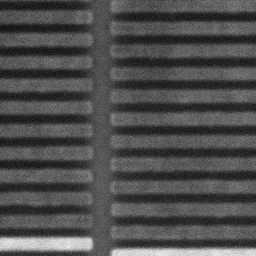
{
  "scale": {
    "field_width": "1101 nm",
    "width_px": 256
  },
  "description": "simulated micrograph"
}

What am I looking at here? groups of lines, slits or small figures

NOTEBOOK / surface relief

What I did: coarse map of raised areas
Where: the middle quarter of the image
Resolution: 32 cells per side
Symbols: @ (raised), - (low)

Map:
@@@@@@--------------------------
------------@@@@@@@@@@@@@@@@@@@@
------------@@@@@@@@@@@@@@@@@@@@
------------@@@@@@@@@@@@@@@@@@@@
@@@@@@@-------------------------
@@@@@@@-------------------------
@@@@@@--------------------------
------------@@@@@@@@@@@@@@@@@@@@
------------@@@@@@@@@@@@@@@@@@@@
-------------@@@@@----------@@@@
@@@@@@@-------------------------
@@@@@@@-------------------------
-------------@@--@@@@-------@@@@
------------@@@@@@@@@@@@@@@@@@@@
------------@@@@@@@@@@@@@@@@@@@@
@@@@@@--------------------------
@@@@@@@-------------------------
@@@@@@@-------------------------
------------@@@@@@@@@@@@@@@@@@@@
------------@@@@@@@@@@@@@@@@@@@@
------------@@@@@@@@@@@@@@@@@@@@
@@@@@@@-------------------------
@@@@@@@-------------------------
@@@@@@--------------------------
------------@@@@@@@@@@@@@@@@@@@@
------------@@@@@@@@@@@@@@@@@@@@
--------------------------------
@@@@@@@-------------------------
@@@@@@@-------------------------
-------------------------------@
------------@@@@@@@@@@@@@@@@@@@@
------------@@@@@@@@@@@@@@@@@@@@